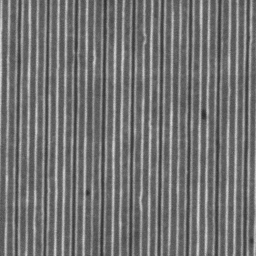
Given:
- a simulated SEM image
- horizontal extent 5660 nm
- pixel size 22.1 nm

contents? parallel lines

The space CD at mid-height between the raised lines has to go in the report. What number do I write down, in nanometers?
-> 110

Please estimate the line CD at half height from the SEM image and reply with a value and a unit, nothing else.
177 nanometers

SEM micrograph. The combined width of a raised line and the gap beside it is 316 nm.